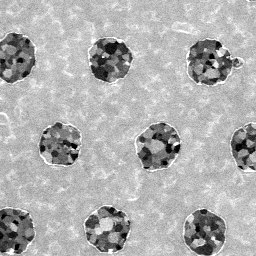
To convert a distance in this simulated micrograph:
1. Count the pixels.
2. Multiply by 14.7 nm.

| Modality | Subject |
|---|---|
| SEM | raised bodies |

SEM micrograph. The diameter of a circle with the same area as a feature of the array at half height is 0.681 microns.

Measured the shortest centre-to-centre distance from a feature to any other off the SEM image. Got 1.43 um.